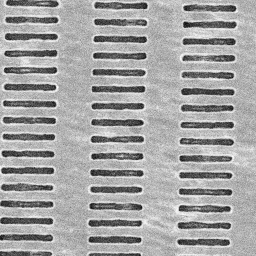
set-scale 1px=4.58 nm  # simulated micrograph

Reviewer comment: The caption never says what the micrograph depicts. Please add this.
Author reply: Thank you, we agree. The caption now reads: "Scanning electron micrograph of a regular array of holes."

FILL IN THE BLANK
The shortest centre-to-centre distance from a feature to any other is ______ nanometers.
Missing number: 76.3